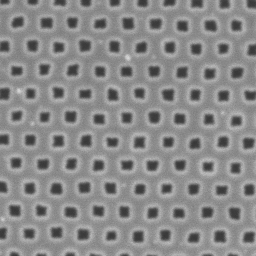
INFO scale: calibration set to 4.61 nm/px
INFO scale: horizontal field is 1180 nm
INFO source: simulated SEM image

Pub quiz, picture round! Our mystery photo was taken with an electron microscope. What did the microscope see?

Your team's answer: a regular array of holes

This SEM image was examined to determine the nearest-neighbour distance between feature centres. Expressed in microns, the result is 0.12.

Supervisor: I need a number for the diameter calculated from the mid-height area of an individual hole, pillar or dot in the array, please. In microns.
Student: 0.0588